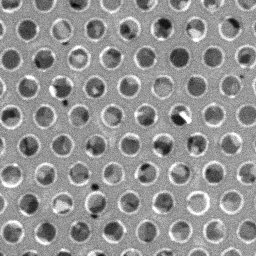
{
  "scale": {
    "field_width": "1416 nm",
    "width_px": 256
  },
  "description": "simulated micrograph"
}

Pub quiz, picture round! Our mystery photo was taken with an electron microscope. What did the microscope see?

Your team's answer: a regular array of raised bodies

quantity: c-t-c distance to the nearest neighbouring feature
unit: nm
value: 182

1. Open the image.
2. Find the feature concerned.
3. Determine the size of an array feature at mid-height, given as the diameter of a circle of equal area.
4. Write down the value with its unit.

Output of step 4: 122 nanometers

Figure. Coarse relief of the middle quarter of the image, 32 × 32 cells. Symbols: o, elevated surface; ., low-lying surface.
..oooo....oooo.....ooo.....ooo..
................................
................................
o......oo......ooo.....ooo.....o
oo....oooo....ooooo...ooooo....o
oo...ooooo....ooooo...ooooo....o
oo...ooooo....ooooo...ooooo....o
oo....oooo....oooo.....oooo....o
.......o................o.......
................................
...oo..............ooo......oo..
..oooo....oooo....ooooo....oooo.
.ooooo....ooooo...ooooo....ooooo
.ooooo....ooooo...ooooo....ooooo
..oooo....oooo....ooooo....oooo.
...oo......oo.......o.......o...
................................
................................
oo....oooo.....oooo....oooo....o
oo....oooo....ooooo...ooooo....o
oo...ooooo....ooooo...ooooo....o
oo...ooooo....ooooo....oooo....o
o.....oooo.....ooo.....ooo......
................................
................................
..ooo......ooo.....oooo....oooo.
.ooooo....ooooo...ooooo....oooo.
.ooooo....ooooo...ooooo...oooooo
.ooooo....ooooo...ooooo....oooo.
..oooo.....ooo.....ooo.....oooo.
................................
................................